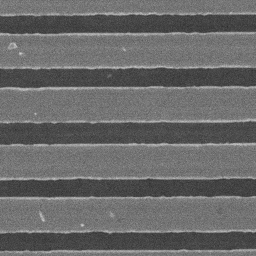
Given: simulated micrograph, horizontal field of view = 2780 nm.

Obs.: lines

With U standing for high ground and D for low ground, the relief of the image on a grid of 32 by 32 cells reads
UUUUUUUUUUUUUUUUUUUUUUUUUUUUUUUU
UUUUUUUUUUUUUUUUUUUUUUUUUUUUUUUU
DDDDDDDDDDDDDDDDDDDDDDDDDDDDDDDD
DDDDDDDDDDDDDDDDDDDDDDDDDDDDDDDD
UUUUUUUUUUUUUUUUUUUUUUUUUUUUUUUU
UUUUUUUUUUUUUUUUUUUUUUUUUUUUUUUU
UUUUUUUUUUUUUUUUUUUUUUUUUUUUUUUU
UUUUUUUUUUUUUUUUUUUUUUUUUUUUUUUU
UUDDUDUDDDDUDDUDDDDDDDUDDDDDDDDD
DDDDDDDDDDDDDDDDDDDDDDDDDDDDDDDD
DDDDDDDDDDDDDDDDDDDDDDDDDDDDDDDD
UUUUUUUUUUUUUUUUUUUUUUUUUUUUUUUU
UUUUUUUUUUUUUUUUUUUUUUUUUUUUUUUU
UUUUUUUUUUUUUUUUUUUUUUUUUUUUUUUU
UUUUUUUUUUUUUUUUUUUUUUUUUUUUUUUU
DDDDDDDDDDDDDDDDDDDDDDDDDDDDDDDD
DDDDDDDDDDDDDDDDDDDDDDDDDDDDDDDD
DDDDDDDDDDDDDDDDDDDDDDDDDDDDDDDD
UUUUUUUUUUUUUUUUUUUUUUUUUUUUUUUU
UUUUUUUUUUUUUUUUUUUUUUUUUUUUUUUU
UUUUUUUUUUUUUUUUUUUUUUUUUUUUUUUU
UUUUUUUUUUUUUUUUUUUUUUUUUUUUUUUU
DDDDDDDDDDDDDDDDDDDDDDDDDDDDDDDD
DDDDDDDDDDDDDDDDDDDDDDDDDDDDDDDD
DDDDDDDDDDDDDDDDDDDDDDDDDDDDDDDD
UUUUUUUUUUUUUUUUUUUUUUUUUUUUUUUU
UUUUUUUUUUUUUUUUUUUUUUUUUUUUUUUU
UUUUUUUUUUUUUUUUUUUUUUUUUUUUUUUU
UUUUUUUUUUUUUUUUUUUUUUUUUUUUUUUU
DDDDDDDDDDDDDDDDDDDDDDDDDDDDDDDD
DDDDDDDDDDDDDDDDDDDDDDDDDDDDDDDD
UUUUUUUUUUUUUUUUUUUUUUUUUUUUUUUU